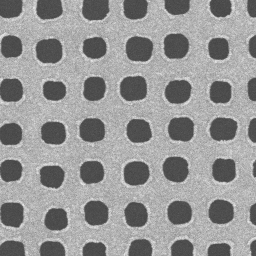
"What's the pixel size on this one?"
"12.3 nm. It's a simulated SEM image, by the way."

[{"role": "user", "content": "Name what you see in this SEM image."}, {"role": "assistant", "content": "a regular array of holes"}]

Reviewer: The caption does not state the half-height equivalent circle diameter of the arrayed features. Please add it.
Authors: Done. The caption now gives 0.314 µm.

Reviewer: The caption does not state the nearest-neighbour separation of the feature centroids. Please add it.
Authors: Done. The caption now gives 487 nanometers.